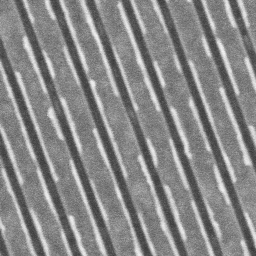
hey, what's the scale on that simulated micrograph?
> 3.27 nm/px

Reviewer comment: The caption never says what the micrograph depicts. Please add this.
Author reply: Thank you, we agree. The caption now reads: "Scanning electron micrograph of parallel lines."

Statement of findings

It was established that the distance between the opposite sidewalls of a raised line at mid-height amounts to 78.7 nm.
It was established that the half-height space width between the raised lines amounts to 31.5 nanometers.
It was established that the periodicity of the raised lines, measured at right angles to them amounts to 33.5 pixels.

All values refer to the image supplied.